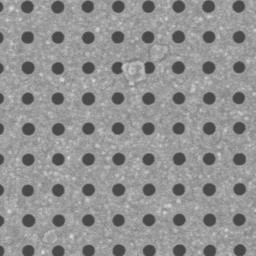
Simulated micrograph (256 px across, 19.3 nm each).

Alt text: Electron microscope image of a regular array of holes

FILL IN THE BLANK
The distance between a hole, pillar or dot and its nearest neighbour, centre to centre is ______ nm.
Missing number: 579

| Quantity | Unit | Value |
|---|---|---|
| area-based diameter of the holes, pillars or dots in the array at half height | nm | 256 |